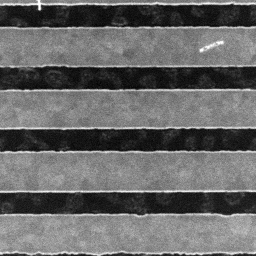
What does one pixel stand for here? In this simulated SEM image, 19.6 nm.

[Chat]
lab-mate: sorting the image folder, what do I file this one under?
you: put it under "one or a few lines or trenches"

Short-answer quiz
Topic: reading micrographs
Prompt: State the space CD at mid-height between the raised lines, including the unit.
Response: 463 nm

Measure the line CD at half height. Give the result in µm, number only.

0.762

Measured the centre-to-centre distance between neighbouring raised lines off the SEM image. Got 1.22 µm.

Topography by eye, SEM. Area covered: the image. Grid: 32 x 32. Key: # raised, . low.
#..##........#..................
................................
................................
##...#...##..#######.###########
################################
################################
################################
################################
................................
................................
................................
################################
################################
################################
################################
################################
................................
................................
................................
################################
################################
################################
################################
################################
................................
................................
................................
################################
################################
################################
################################
###############.################